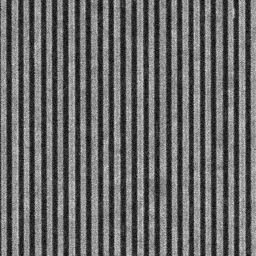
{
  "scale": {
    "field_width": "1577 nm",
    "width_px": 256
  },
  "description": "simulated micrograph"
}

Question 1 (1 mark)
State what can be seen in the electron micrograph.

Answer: parallel lines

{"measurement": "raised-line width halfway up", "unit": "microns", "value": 0.0308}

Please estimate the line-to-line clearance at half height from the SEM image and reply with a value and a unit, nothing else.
0.037 microns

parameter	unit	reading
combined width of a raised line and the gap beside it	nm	70